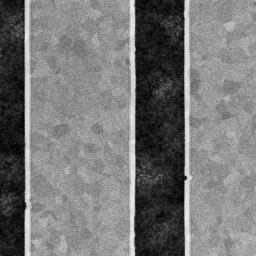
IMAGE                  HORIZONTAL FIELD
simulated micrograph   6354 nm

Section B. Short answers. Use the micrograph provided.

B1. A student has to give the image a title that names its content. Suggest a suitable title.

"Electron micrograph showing one or a few lines or trenches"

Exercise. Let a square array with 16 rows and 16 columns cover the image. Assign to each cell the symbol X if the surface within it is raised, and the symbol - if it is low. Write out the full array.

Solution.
--XXXXXX----XXXX
--XXXXXX----XXXX
--XXXXXX----XXXX
--XXXXXX----XXXX
--XXXXXX----XXXX
--XXXXXX----XXXX
--XXXXXX----XXXX
--XXXXXX----XXXX
--XXXXXX----XXXX
--XXXXXX----XXXX
--XXXXXX----XXXX
--XXXXXX----XXXX
--XXXXXX----XXXX
--XXXXXX----XXXX
--XXXXXX----XXXX
--XXXXXX----XXXX